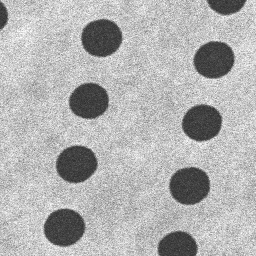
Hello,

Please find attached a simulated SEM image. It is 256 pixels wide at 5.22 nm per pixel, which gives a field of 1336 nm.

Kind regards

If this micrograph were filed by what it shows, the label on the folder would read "holes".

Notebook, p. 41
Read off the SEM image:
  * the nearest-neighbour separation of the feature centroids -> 0.336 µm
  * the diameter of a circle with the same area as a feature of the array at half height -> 39.5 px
